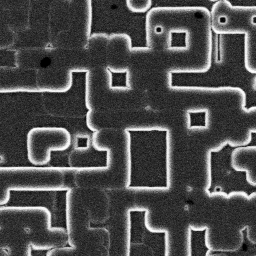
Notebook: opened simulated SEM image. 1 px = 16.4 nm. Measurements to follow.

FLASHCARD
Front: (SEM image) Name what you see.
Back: wiring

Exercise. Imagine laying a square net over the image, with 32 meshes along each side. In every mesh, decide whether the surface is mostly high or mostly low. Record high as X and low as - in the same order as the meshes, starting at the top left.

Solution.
XXXXXXXXXXX-----XXX--------XX---
XXXXXXXXXXX--------XXXXXXXXXXXXX
XXXXXXXXXXX-------XXXXXXXXXXXXXX
XXXXXXXXXXX-------XXXXXXXXXXXXXX
XXXXXXXXXXXXXXXX--XXX--XXX-----X
XXXXXXXXXXXXXXXX--XXX--XXX-----X
XXXXXXXXXXXXXXXXXXXXXXXXXX-----X
XXXXXXXXXXXXXXXXXXXXXXXXXX-----X
XXXXXXXXXXXXXXXXXXXXXXXXXX-----X
XXXXXXXXX--XXX--XXXXX-----------
XXXXXXXXX--XXX--XXXXX-----------
-----------XXXXXXXXXXXXXXXXXXX--
-----------XXXXXXXXXXXXXXXXXXXX-
-----------XXXXXXXXXXXXXXXXXXXX-
-----------XXXXXXXXXXXXX--XXXXXX
-----------XXXXXXXXXXXXX--XXXXXX
----XXXX----XXXX-----XXXXXXXXXXX
----XXXXX---XXXX-----XXXXXXXXXX-
----XXXX----XXXX-----XXXXXXX--XX
----XX-------XXX-----XXXXX---XXX
----X--------XXX-----XXXXX---XXX
XXXXXXXXXXXXXXXX-----XXXXX----XX
XXXXXXXXXXXXXXXX-----XXXXX-----X
XXXXXXXXXXXXXXXXX----XXXXX------
X-------XXXXXXXXXXXXXXXXXXXXXXXX
--------XXXXXXXXXXXXXXXXXXXXXXXX
XXXXXX--XXXXXXXX--XXXXXXXXXXXXXX
XXXXXX--XXXXXXXX--XXXXXXXXXXXXXX
XXXXXXX-XXXXXXXX---XXXXXXXXXXXXX
XXXXXXXXXXXXXXXX-----XXX--XXXXXX
XXXXXXXXXXXXXXXX-----XXX--XXXXXX
XXXX--XXXXXXXXXX-----XXX--XXXXXX